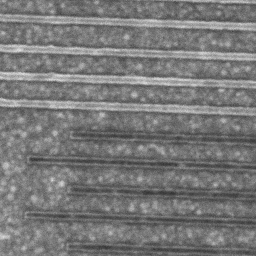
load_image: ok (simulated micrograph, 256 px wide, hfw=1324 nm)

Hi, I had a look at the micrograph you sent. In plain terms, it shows parallel lines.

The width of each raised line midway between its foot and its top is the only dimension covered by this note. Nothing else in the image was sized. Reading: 31 nm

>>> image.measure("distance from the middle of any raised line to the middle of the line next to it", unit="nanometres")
146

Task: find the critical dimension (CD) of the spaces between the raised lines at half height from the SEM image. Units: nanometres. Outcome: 111